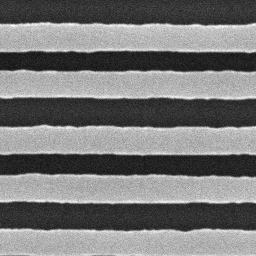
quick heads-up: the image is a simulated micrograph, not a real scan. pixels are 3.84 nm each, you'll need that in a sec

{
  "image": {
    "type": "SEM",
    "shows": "lines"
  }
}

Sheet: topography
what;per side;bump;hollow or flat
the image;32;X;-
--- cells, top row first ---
--------------------------------
--------------------------------
--------------------------------
XXXXXXXXXXXXXXXXXXXXXXXXXXXXXXXX
XXXXXXXXXXXXXXXXXXXXXXXXXXXXXXXX
XXXXXXXXXXXXXXXXXXXXXXXXXXXXXXXX
-------------------------------X
--------------------------------
--------------------------------
XXXXXXXXXXXXXXXXXXXXXXXXXXXXXXXX
XXXXXXXXXXXXXXXXXXXXXXXXXXXXXXXX
XXXXXXXXXXXXXXXXXXXXXXXXXXXXXXXX
--------------------------------
--------------------------------
--------------------------------
--------------------------------
XXXXXXXXXXXXXXXXXXXXXXXXXXXXXXXX
XXXXXXXXXXXXXXXXXXXXXXXXXXXXXXXX
XXXXXXXXXXXXXXXXXXXXXXXXXXXXXXXX
--------------------------------
--------------------------------
--------------------------------
XXXXXXXXXXXXXXXXXXXXXXXXXXXXXXXX
XXXXXXXXXXXXXXXXXXXXXXXXXXXXXXXX
XXXXXXXXXXXXXXXXXXXXXXXXXXXXXXXX
--------------------------------
--------------------------------
--------------------------------
--------------------------------
XXXXXXXXXXXXXXXXXXXXXXXXXXXXXXXX
XXXXXXXXXXXXXXXXXXXXXXXXXXXXXXXX
XXXXXXXXXXXXXXXXXXXXXXXXXXXXXXXX